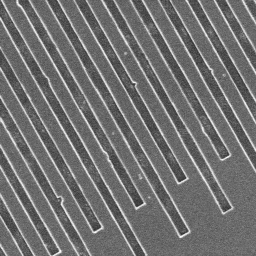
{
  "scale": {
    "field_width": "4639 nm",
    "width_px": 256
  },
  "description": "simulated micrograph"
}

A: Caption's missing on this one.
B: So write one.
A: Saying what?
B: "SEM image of parallel lines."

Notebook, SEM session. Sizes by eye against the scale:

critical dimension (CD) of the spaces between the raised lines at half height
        0.187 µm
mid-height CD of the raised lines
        266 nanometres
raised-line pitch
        442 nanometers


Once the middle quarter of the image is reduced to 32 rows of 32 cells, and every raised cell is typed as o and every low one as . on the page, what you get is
.oooo...oooo...oooo...oooo...ooo
.oooo...oooo...ooooo..ooooo..ooo
..oooo...oooo...oooo...oooo...oo
..oooo....oooo...oooo...oooo...o
...oooo...oooo...oooo...oooo...o
....oooo...oooo...oooo...oooo...
o...oooo...oooo...oooo...oooo...
oo...oooo...oooo...oooo...oooo..
oo...oooo...oooo...ooooo..ooooo.
ooo...oooo...oooo...oooo...oooo.
ooo...ooooo...ooo....oooo..ooooo
oooo...oooo...oooo...oooo...oooo
.ooo....oooo...oooo...oooo..oooo
.oooo...oooo...oooo...oooo...ooo
..oooo...oooo...oooo...oooo...oo
..oooo...oooo...oooo...ooooo..oo
...oooo...oooo...oooo...oooo...o
...ooooo..oooo....oooo...oooo...
o...oooo...oooo...oooo...oooo...
o....ooo....oooo...oooo...oooo..
oo...oooo...oooo...oooo...oooo..
ooo...oooo...oooo...oooo...oooo.
ooo...ooooo..oooo...oooo...oooo.
oooo...oooo...oooo...oooo...oooo
oooo...ooooo..oooo....oooo...ooo
.oooo...oooo...oooo...oooo...ooo
..ooo....oooo..ooooo...oooo...oo
..oooo...oooo...oooo...oooo...oo
...oooo...oooo...oooo...oooo...o
...oooo...oooo...oooo...oooo..oo
o...oooo...oooo...oooo...ooooooo
o...oooo...oooo...oooo....oooooo